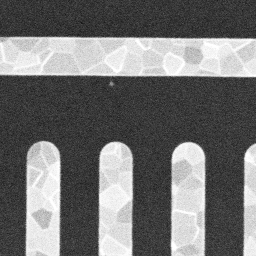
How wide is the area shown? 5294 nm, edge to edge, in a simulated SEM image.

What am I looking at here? groups of lines, slits or small figures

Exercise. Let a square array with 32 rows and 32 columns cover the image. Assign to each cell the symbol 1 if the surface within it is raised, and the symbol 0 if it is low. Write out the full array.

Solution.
00000000000000000000000000000000
00000000000000000000000000000000
00000000000000000000000000000000
00000000000000000000000000000000
00000000000000000000000000000000
11111111111111111101111111000111
11111111111111111111111111111111
11111111111111111111111111111111
11000111111111111111111111111111
00000000000000000000000000000000
00000000000000000000000000000000
00000000000000000000000000000000
00000000000000000000000000000000
00000000000000000000000000000000
00000000000000000000000000000000
00000000000000000000000000000000
00000000000000000000000000000000
00000000000000000000000000000000
00001110000001110000001110000001
00001110000001110000001110000001
00001110000001110000001110000001
00000110000001110000001110000001
00000110000001110000001110000001
00001110000001110000001110000001
00011110000001110000001110000001
00011110000001110000001110000001
00011110000001110000001110000001
00011110000011110000001110000001
00011110000011110000001110000001
00011110000011110000001110000001
00011110000011110000001110000001
00011110000001110000001110000001